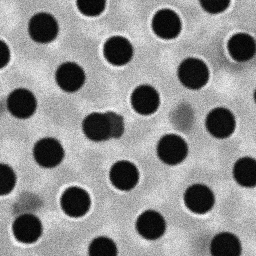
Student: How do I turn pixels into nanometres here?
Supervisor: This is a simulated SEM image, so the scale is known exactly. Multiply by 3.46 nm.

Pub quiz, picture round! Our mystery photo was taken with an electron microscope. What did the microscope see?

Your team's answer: a regular array of holes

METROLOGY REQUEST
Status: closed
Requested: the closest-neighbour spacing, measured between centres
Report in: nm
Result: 190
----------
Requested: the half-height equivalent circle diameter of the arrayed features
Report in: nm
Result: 106